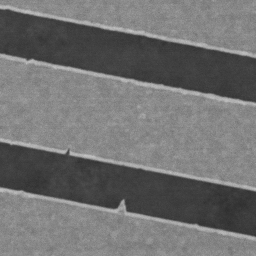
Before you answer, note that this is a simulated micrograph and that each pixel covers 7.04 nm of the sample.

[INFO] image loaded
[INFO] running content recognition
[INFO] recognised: one or a few lines or trenches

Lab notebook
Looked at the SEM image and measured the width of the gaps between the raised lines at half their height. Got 337 nm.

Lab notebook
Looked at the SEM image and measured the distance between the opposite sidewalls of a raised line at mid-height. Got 585 nm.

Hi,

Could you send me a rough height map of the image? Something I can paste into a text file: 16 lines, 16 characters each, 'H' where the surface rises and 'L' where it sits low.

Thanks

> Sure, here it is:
HHHHHHHHHHHHHHHH
LLLLLLHHHHHHHHHH
LLLLLLLLLLLHHHHH
LLLLLLLLLLLLLLLL
HHHHHLLLLLLLLLLL
HHHHHHHHHHLLLLLL
HHHHHHHHHHHHHHHH
HHHHHHHHHHHHHHHH
HHHHHHHHHHHHHHHH
LLLLHHHHHHHHHHHH
LLLLLLLLLHHHHHHH
LLLLLLLLLLLLLLHH
HHHHLLLLLLLLLLLL
HHHHHHHHHLLLLLLL
HHHHHHHHHHHHHHLL
HHHHHHHHHHHHHHHH